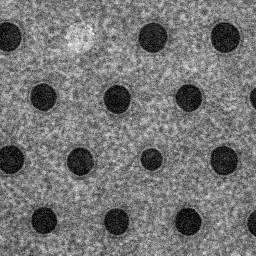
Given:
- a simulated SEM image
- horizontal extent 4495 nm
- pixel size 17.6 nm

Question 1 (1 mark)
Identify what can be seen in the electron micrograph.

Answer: a regular array of raised bodies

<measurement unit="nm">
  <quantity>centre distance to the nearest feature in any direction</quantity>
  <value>1230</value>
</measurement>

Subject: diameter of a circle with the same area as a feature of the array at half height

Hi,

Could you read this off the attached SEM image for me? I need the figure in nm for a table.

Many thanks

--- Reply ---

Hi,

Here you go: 506